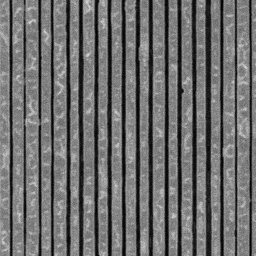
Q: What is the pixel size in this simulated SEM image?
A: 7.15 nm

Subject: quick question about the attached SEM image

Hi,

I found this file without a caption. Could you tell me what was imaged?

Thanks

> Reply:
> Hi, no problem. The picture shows parallel lines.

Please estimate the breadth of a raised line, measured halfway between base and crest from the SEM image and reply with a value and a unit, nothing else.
0.0688 um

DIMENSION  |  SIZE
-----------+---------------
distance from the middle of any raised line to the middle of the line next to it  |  101 nm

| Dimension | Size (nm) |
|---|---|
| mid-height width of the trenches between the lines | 31.3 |